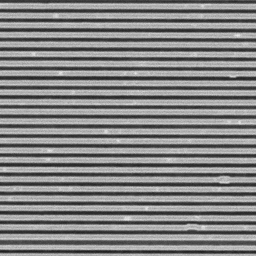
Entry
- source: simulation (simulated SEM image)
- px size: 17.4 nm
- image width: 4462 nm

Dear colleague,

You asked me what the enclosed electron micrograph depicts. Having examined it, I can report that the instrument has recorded parallel lines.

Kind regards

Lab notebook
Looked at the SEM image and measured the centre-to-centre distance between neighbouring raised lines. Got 9.66 px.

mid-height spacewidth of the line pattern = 78.5 nanometres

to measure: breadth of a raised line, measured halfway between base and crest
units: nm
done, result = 95.9